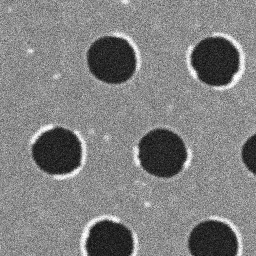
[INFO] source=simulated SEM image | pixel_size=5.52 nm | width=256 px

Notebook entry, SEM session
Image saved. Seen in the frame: holes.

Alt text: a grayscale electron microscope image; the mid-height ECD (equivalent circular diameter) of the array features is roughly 271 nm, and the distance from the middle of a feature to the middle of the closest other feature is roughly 0.575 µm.